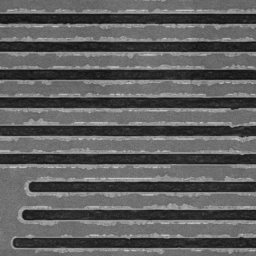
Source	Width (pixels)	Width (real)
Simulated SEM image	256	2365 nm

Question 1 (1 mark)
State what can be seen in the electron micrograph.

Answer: parallel lines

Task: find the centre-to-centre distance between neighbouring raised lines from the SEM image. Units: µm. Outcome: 0.259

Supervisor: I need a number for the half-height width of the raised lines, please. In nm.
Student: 152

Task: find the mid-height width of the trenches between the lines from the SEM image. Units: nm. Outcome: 102